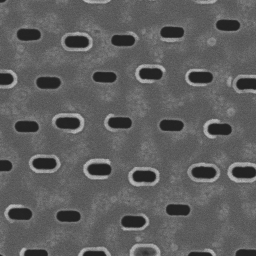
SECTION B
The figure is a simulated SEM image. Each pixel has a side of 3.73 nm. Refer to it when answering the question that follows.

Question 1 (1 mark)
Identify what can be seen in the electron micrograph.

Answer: a regular array of holes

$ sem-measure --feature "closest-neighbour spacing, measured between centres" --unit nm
171